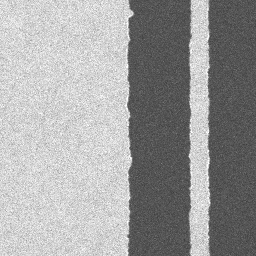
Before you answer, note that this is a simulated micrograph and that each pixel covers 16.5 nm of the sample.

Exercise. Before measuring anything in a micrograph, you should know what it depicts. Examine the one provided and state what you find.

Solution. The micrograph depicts one or a few lines or trenches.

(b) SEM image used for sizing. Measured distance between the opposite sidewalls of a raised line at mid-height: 1040 nm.